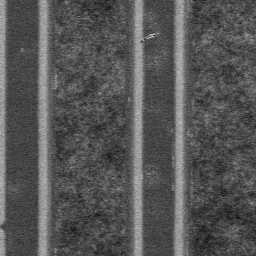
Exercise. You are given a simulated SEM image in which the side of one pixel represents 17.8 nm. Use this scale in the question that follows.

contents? one or a few lines or trenches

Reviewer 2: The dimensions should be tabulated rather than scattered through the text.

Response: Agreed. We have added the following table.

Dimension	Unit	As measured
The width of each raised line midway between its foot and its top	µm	0.756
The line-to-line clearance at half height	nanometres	1670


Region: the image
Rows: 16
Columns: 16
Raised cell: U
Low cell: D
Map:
UUUDDDDDDUUDDDDD
UUUDDDDDDUUDDDDD
UUUDDDDDDUUDDDDD
UUUDDDDDDUUDDDDD
UUUDDDDDDUUDDDDD
UUUDDDDDDUUDDDDD
UUUDDDDDDUUDDDDD
UUUDDDDDDUUDDDDD
UUUDDDDDDUUDDDDD
UUUDDDDDDUUDDDDD
UUUDDDDDDUUDDDDD
UUUDDDDDDUUDDDDD
UUUDDDDDDUUDDDDD
UUUDDDDDDUUDDDDD
UUUDDDDDDUUDDDDD
UUUDDDDDDUUDDDDD